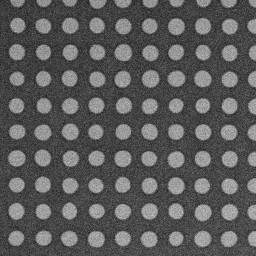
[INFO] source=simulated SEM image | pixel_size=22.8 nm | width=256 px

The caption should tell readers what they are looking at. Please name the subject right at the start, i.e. an array of small figures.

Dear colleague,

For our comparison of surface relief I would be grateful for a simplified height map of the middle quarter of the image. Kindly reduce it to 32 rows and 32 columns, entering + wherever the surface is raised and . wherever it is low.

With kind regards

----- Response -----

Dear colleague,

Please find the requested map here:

................................
................................
+++....+++...+++....+++....+++..
+++....+++...+++....++++..++++..
+++....+++...+++....++++..++++..
........+.....++....+++....++...
................................
................................
................................
+++...++++...++++...+++....++...
+++...++++...++++...+++...++++..
+++....+++...++++...+++....++...
................................
................................
................................
+++....++.....++....+++....++...
+++...++++...++++...+++...++++..
++++..++++...++++...+++...++++..
+++....++.....++....+++....++...
................................
................................
................................
+++....+++...+++....+++....++...
++++..++++...++++..++++...++++..
+++...++++...++++...+++...++++..
.+............++...........++...
................................
................................
..............+.................
+++...+++....+++....+++...++++..
+++...++++...+++....+++...++++..
+++....++....+++....+++...++++..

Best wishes